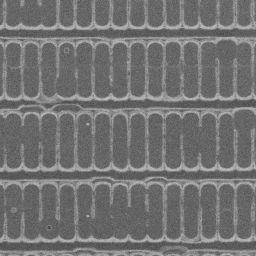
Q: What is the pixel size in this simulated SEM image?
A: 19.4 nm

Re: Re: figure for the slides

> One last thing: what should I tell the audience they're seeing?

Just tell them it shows wiring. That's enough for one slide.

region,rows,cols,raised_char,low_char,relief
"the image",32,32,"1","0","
11111111111111111111111111111111
11111111111111111111111111111111
11111111111111111111111111111111
00000000001000000000000000000000
00000000000000000000000000000000
11111111111111111111111111111111
11111111111111111111111111111111
11111111111111111111111111111111
11111111111111111111111111111111
11111111111111111111111111111111
11111111111111111111111111111111
11111111111111111111111111111111
00000000000000000000000000000000
00000000000000000000000000000000
11111111111111111111111111111111
11111111111111111111111111111111
11111111111111111111111111111111
11111111111111111111111111111111
11111111111111111111111111111111
11111111111111111111111111111111
11111111111111111111111111111111
00000000000000000000000000000000
00000000000000000000000000000000
11111111111111111111111111111111
11111111111111111111111111111111
11111111111111111111111111111111
11111111111111111111111111111111
11111111111111111111111111111111
11111111111111111111111111111111
11111111111111111111111111111111
00000000000000000000000000000000
00000000000000000000000000000000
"